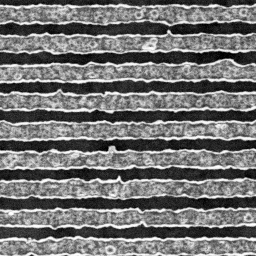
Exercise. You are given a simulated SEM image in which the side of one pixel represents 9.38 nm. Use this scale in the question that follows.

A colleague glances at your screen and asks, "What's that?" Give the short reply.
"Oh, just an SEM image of parallel lines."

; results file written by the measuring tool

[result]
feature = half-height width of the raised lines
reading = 0.158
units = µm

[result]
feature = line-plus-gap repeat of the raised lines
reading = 273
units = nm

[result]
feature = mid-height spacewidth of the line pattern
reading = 118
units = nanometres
